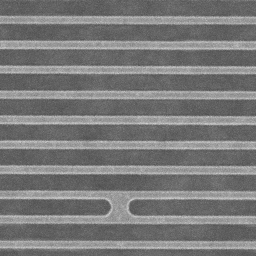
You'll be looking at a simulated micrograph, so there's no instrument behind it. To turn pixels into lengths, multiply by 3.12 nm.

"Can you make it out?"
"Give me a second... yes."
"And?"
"parallel lines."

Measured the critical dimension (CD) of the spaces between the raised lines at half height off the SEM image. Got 54.6 nanometers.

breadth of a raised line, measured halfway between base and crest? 23 nanometers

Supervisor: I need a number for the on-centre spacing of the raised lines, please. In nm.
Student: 77.8